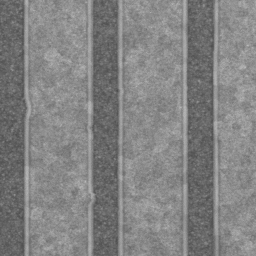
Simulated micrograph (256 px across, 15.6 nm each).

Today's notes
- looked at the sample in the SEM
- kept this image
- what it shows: one or a few lines or trenches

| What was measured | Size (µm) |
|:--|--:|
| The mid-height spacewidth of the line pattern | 0.49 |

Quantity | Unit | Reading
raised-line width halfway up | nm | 982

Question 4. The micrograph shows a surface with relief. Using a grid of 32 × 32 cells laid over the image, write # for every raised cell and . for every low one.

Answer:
...########....########....#####
...########....########....#####
...########....########....#####
...########....########....#####
...########....########....#####
...########....########....#####
...########....########....#####
...########....########....#####
...########....########....#####
...########....########....#####
...########....########....#####
...########....########....#####
....#######....########....#####
....#######....########....#####
....#######....########....#####
...########....########....#####
...########....########....#####
...########....########....#####
...########....########....#####
...########....########....#####
...########....########....#####
...########....########....#####
...########....########....#####
...########....########....#####
....#######....########....#####
....#######....########....#####
....#######....########....#####
...########....########....#####
...########....########....#####
...########....########....#####
...########....########....#####
...########....########....#####